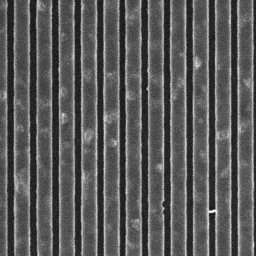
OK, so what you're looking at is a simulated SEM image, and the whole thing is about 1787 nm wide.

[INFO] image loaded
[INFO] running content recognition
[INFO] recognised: parallel lines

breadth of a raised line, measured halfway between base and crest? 0.106 microns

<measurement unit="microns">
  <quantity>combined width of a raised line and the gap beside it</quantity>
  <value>0.156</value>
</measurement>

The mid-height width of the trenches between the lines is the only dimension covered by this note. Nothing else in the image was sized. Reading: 50.6 nanometers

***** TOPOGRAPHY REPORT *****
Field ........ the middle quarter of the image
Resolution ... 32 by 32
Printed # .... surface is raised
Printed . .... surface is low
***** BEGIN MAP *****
##..####..####..###..####..###..
##..####..####..###..####..###..
##...###..####..###..####..###..
##...###..####..###..####..###..
##...###..####..###..####..###..
##..####..####..###..####..###..
##..####..####..###..####..###..
##...###..####..###..####..###..
##...###..####..###..####..###..
##..####..####..###..####..###..
##..####..####..###..####..###..
##..####..####..###..####..###..
##..####..####..###..####..###..
##...###..####..###..####..###..
##...###..####..###..####..###..
##..####..####..###..####..###..
##...###..####..###..####..###..
##..####..####..###..####..###..
##..####..####..###..####..###..
##...###..####..###..####..###..
##...###..####..###..####..###..
##...###..####..###..####..###..
##...###..####..###..####..###..
##...###..####..###..####..###..
##..####..####..###..####..###..
##..####..####..###..####..###..
##...###..####..###..####..###..
###..###..####..###..####..####.
###..###..####..###..####..####.
##...###..####..###..####..###..
##..####..####..###..####..###..
##...###..####..###..####..###..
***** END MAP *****